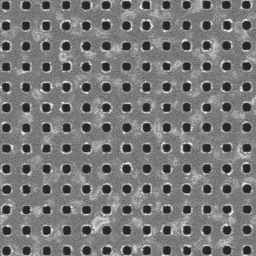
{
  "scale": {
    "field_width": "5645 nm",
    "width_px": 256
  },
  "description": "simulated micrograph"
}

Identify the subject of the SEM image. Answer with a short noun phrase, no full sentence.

a regular array of holes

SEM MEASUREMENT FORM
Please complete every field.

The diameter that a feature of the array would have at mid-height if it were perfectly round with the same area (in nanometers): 205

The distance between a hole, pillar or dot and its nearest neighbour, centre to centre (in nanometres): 438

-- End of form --